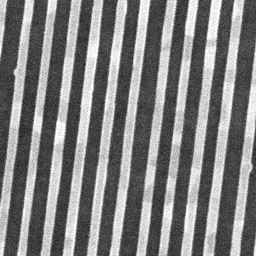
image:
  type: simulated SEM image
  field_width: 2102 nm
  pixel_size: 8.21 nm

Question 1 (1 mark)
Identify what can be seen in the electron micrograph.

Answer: parallel lines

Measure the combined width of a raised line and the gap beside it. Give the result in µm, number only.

0.191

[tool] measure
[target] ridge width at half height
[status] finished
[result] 7.94 px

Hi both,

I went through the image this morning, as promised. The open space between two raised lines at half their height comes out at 123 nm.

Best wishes